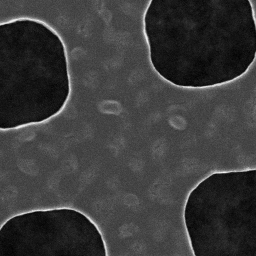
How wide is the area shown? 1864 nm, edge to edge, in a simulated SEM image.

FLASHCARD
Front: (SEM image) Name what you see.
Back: holes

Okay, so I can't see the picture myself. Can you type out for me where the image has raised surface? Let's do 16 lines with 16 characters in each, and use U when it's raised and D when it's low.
UUUUUUUUUDDDDDDD
DDDUUUUUUDDDDDDD
DDDDUUUUUDDDDDDD
DDDDUUUUUDDDDDDD
DDDDUUUUUUDDDDDU
DDDDUUUUUUUUUUUU
DDDDUUUUUUUUUUUU
DDDUUUUUUUUUUUUU
UUUUUUUUUUUUUUUU
UUUUUUUUUUUUUUUU
UUUUUUUUUUUUUUUU
UUUUUUUUUUUUUDDD
UUUUUUUUUUUUDDDD
UDDDDUUUUUUUDDDD
DDDDDDUUUUUUDDDD
DDDDDDDUUUUUDDDD